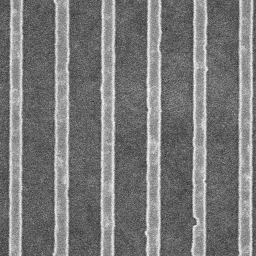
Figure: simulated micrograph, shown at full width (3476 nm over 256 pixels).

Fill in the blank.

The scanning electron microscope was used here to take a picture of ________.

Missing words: parallel lines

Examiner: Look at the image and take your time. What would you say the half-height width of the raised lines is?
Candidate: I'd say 153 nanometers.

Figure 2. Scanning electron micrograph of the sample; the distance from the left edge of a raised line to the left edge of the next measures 0.624 µm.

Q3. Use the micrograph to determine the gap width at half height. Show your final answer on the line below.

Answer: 468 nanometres